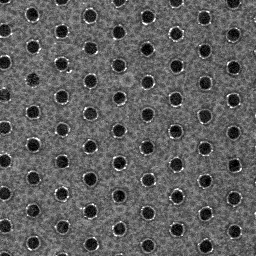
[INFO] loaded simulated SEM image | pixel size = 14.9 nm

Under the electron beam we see a regular array of raised bodies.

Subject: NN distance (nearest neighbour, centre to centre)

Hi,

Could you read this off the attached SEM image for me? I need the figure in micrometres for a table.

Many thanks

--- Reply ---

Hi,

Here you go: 0.481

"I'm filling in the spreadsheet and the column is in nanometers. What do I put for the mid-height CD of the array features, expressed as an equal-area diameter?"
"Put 206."